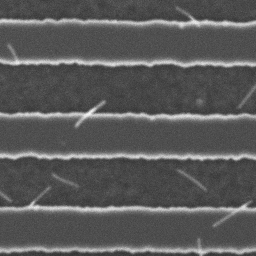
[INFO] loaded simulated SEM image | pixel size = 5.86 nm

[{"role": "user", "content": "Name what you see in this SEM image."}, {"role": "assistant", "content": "lines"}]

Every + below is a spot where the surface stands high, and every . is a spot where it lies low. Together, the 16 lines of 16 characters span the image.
................
++++++++++++++++
++++++++++++++++
++++++++++++++++
................
................
................
++++++++++++++++
++++++++++++++++
++++++++++++++++
................
................
................
++++++++++++++++
++++++++++++++++
++++++++++++++++